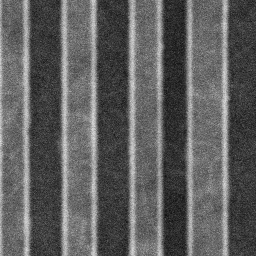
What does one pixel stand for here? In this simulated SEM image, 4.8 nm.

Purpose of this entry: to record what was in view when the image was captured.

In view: one or a few lines or trenches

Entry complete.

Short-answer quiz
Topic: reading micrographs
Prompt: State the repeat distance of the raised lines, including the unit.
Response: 308 nanometers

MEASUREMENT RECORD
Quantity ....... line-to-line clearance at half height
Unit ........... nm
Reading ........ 178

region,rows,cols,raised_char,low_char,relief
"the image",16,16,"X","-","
XX--XX--XX--XX--
XX--XX--XX--XX--
XX--XX--XX--XX--
XX--XX--XX--XX--
XX--XX--XX--XX--
XX--XX--XX--XX--
XX--XX--XX--XX--
XX--XX--XX--XX--
XX--XX--XX--XX--
XX--XX--XX--XX--
XX--XX--XX--XX--
XX--XX--XX--XX--
XX--XX--XX--XX--
XX--XX--XX--XX--
XX--XX--XX--XX--
XX--XX--XX--XX--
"